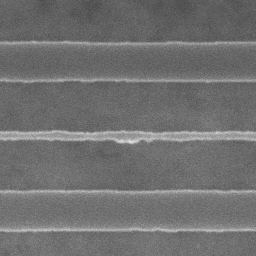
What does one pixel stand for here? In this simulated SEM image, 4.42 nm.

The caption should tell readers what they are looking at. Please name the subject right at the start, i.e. lines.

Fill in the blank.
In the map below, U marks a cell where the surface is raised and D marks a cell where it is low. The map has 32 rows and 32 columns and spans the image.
DDDDDDDDDDDDDDDDDDDDDDDDDDDDDDDD
DDDDDDDDDDDDDDDDDDDDDDDDDDDDDDDD
DDDDDDDDDDDDDDDDDDDDDDDDDDDDDDDD
DDDDDDDDDDDDDDDDDDDDDDDDDDDDDDDD
DDDDDDDDDDDDDDDDDDDDDDDDDDDDDDDD
UUUUUUUUUUUUUUUUUUUUUUUUUUUUUUUU
UUUUUUUUUUUUUUUUUUUUUUUUUUUUUUUU
UUUUUUUUUUUUUUUUUUUUUUUUUUUUUUUU
UUUUUUUUUUUUUUUUUUUUUUUUUUUUUUUU
UUUUUUUUUUUUUUUUUUUUUUUUUUUUUUUU
DDDDDDDDDDDDDDDDDDDDDDDDDDDDDDDD
DDDDDDDDDDDDDDDDDDDDDDDDDDDDDDDD
DDDDDDDDDDDDDDDDDDDDDDDDDDDDDDDD
DDDDDDDDDDDDDDDDDDDDDDDDDDDDDDDD
DDDDDDDDDDDDDDDDDDDDDDDDDDDDDDDD
DDDDDDDDDDDDDDDDDDDDDDDDDDDDDDDD
DDDDDDUUDDDDDDDUDDDDDDDDDDDDDDDD
DDDDDDDDDDDDDDUUUDDDDDUDDDDDDDDU
DDDDDDDDDDDDDDDDDDDDDDDDDDDDDDDD
DDDDDDDDDDDDDDDDDDDDDDDDDDDDDDDD
DDDDDDDDDDDDDDDDDDDDDDDDDDDDDDDD
DDDDDDDDDDDDDDDDDDDDDDDDDDDDDDDD
DDDDDDDDDDDDDDDDDDDDDDDDDDDDDDDD
DDDDDDDDDDDDDDDDDDDDDDDDDDDDDDDD
UUUUUUUUUUUUUUUUUUUUUUUUUUUUUUUU
UUUUUUUUUUUUUUUUUUUUUUUUUUUUUUUU
UUUUUUUUUUUUUUUUUUUUUUUUUUUUUUUU
UUUUUUUUUUUUUUUUUUUUUUUUUUUUUUUU
UUUUUUUUUUUUUUUUUUUUUUUUUUUUUUUU
DDDDDDDDDDDDDDDDDDDDDDDDDDDDDDDD
DDDDDDDDDDDDDDDDDDDDDDDDDDDDDDDD
DDDDDDDDDDDDDDDDDDDDDDDDDDDDDDDD